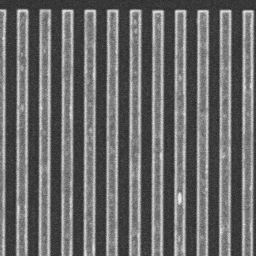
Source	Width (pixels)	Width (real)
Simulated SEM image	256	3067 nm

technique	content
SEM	parallel lines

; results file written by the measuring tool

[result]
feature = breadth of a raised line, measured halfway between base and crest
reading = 123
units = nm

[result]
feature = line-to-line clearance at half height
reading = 154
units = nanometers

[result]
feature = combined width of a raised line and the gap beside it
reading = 0.27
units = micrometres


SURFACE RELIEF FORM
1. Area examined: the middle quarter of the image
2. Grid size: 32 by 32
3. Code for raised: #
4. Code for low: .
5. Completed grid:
##...###...##....##...###...##..
##...###...##....##...###...##..
##...###...##....##...###...##..
##...###...##....##...###...##..
##...###...##....##...###...##..
##...###...##....##...###...##..
##...###...##....##...###...##..
##...###...##....##...###...##..
##...###...##....##...###...##..
##...###...##....##...###...##..
##...###...##....##...###...##..
##...###...##....##...###...##..
##...###...##....##...###...##..
##...###...##....##...###...##..
##...###...##....##...###...##..
##...###...##....##...###...##..
##...###...##....##...###...##..
##...###...##....##...###...##..
##...###...##....##...###...##..
##...###...##....##...###...##..
##...###...##....##...###...##..
##...##....##....##...###...##..
##...##....##....##...###...##..
##...##....##....##...###...##..
##...##....##....##...###...##..
##...##....##....##...###...##..
##...##....##....##...###...##..
##...##....##....##...###...##..
##...##....##....##...##....##..
##...##....##....##...##....##..
##...##....##....##...##....##..
##...##....##....##...##....##..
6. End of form